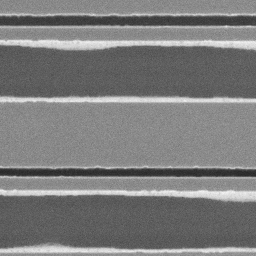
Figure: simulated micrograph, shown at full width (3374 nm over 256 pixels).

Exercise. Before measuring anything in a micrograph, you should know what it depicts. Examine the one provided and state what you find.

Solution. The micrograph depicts lines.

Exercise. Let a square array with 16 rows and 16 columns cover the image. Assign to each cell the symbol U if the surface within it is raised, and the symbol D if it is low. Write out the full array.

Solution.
UUUUUUUUUUUUUUUU
UUUUUUUUUUUUUUUU
UUUUUUUUUUUUUUUU
DDDDDDDDDDDDDDDD
DDDDDDDDDDDDDDDD
DDDDDDDDDDDDDDDD
UUUUUUUUUUUUUUUU
UUUUUUUUUUUUUUUU
UUUUUUUUUUUUUUUU
UUUUUUUUUUUUUUUU
UUUUUUUUUUUUUUUU
UUUUUUUUUUUUUUUU
DDDDDDDDDDDDDDDD
DDDDDDDDDDDDDDDD
DDDDDDDDDDDDDDDD
DDDDDDDDDDDDDDDD